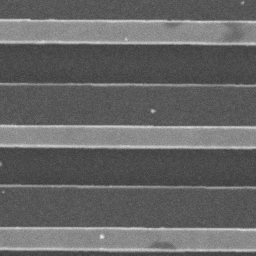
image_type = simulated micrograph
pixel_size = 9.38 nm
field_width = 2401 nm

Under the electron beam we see lines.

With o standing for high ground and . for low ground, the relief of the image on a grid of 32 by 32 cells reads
oooooooooooooooooooooooooooooooo
oooooooooooooooooooooooooooooooo
oooooooooooooooooooooooooooooooo
oooooooooooooooooooooooooooooooo
oooooooooooooooooooooooooooooooo
................................
................................
................................
................................
................................
................................
oooooooooooooooooooooooooooooooo
oooooooooooooooooooooooooooooooo
oooooooooooooooooooooooooooooooo
oooooooooooooooooooooooooooooooo
oooooooooooooooooooooooooooooooo
oooooooooooooooooooooooooooooooo
oooooooooooooooooooooooooooooooo
...............................o
................................
................................
................................
................................
oooooooooooooooooooooooooo..oooo
oooooooooooooooooooooooooooooooo
oooooooooooooooooooooooooooooooo
oooooooooooooooooooooooooooooooo
oooooooooooooooooooooooooooooooo
oooooooooooooooooooooooooooooooo
oooooooooooooooooooooooooooooooo
oooooooooooooooooooooooooooooooo
................................